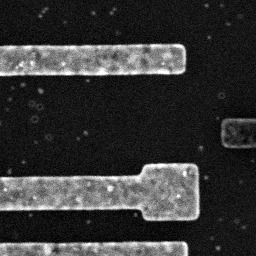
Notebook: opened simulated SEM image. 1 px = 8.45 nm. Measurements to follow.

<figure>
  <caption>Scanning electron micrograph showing wiring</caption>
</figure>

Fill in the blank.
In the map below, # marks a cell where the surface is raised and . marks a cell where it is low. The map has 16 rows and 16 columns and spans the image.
................
................
................
############....
###########.....
................
................
..............##
..............##
................
.........###....
############....
############....
.........###....
................
############....